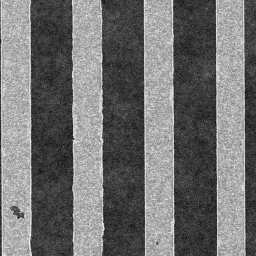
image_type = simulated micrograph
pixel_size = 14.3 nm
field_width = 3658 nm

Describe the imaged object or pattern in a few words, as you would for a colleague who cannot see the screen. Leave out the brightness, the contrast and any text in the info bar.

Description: one or a few lines or trenches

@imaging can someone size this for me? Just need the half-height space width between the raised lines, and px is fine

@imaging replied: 43.1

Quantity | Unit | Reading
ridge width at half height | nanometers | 411